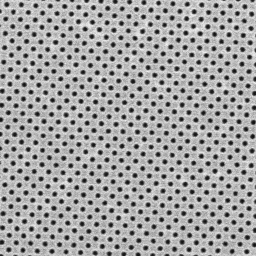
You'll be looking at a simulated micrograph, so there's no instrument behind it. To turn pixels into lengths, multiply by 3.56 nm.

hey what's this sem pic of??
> a regular array of holes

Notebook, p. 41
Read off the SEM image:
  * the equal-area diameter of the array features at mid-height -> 0.0189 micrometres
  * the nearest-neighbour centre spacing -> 35.5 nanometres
